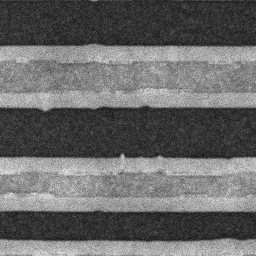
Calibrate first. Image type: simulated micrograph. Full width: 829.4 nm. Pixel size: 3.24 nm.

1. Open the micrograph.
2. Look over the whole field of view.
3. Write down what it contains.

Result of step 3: one or a few lines or trenches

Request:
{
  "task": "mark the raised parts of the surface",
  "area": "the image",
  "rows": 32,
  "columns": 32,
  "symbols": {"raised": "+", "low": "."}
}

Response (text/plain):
................................
................................
................................
................................
................................
................................
...........+....................
++++++++++++++++++++++++++++++++
++++++++++++++++++++++++++++++++
++++++++++++++++++++++++++++++++
++++++++++++++++++++++++++++++++
++++++++++++++++++++++++++++++++
.....++....+....................
................................
................................
................................
................................
................................
................................
................................
................................
++++++++++++++++++++++++++++++++
++++++++++++++++++++++++++++++++
++++++++++++++++++++++++++++++++
++++++++++++++++++++++++++++++++
................................
................................
................................
................................
................................
................................
++++++++++++++++++++++++++++++++